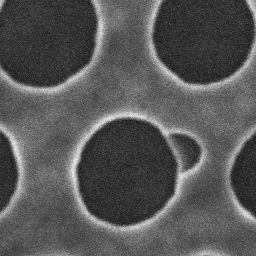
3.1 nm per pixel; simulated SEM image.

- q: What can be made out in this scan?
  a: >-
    holes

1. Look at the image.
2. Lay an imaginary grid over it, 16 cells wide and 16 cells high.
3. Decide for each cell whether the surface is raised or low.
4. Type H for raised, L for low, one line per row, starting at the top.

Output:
LLLLLLHHHHLLLLLL
LLLLLLHHHHLLLLLL
LLLLLLHHHLLLLLLL
LLLLLLHHHHLLLLLL
LLLLLHHHHHHLLLLH
HHHHHHHHHHHHHHHH
HHHHHHHHHHHHHHHH
HHHHHHHLLHHHHHHH
HHHHHHLLLLLLHHHH
LHHHHLLLLLLLLHHL
LHHHHLLLLLLLHHLL
LHHHHLLLLLLHHHLL
LHHHHLLLLLLHHHHL
HHHHHHLLLLHHHHHH
HHHHHHHHHHHHHHHH
HHHHHHHHHHHHHHHH